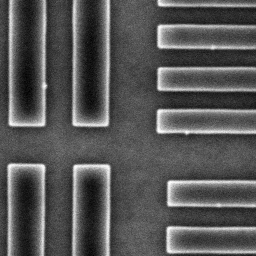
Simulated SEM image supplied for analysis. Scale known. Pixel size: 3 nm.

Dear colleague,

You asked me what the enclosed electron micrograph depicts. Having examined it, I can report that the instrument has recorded groups of lines, slits or small figures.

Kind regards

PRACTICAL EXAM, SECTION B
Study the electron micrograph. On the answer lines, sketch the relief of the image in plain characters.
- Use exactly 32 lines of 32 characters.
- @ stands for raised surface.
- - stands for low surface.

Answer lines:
-@@@@@---@@@@@------@@@@@@@@@@@@
-@@@@@---@@@@@------------------
-@@@@@---@@@@@------------------
-@@@@@---@@@@@------@@@@@@@@@@@@
-@@@@@---@@@@@------@@@@@@@@@@@@
-@@@@@---@@@@@------@@@@@@@@@@@@
-@@@@@---@@@@@------------------
-@@@@@---@@@@@------------------
-@@@@@---@@@@@------------------
-@@@@@---@@@@@------@@@@@@@@@@@@
-@@@@@---@@@@@------@@@@@@@@@@@@
-@@@@@---@@@@@------------------
-@@@@@---@@@@-------------------
-@@@@@---@@@@-------------------
-@@@@@---@@@@-------@@@@@@@@@@@@
-@@@@----@@@@-------@@@@@@@@@@@@
--------------------@@@@@@@@@@@@
--------------------------------
--------------------------------
--------------------------------
--------------------------------
-@@@@----@@@@@------------------
-@@@@----@@@@@------------------
-@@@@----@@@@@-------@@@@@@@@@@@
-@@@@----@@@@@-------@@@@@@@@@@@
-@@@@----@@@@@-------@@@@@@@@@@@
-@@@@----@@@@@------------------
-@@@@----@@@@@------------------
-@@@@----@@@@@-------@@@--------
-@@@@----@@@@@-------@@@@@@@@@@@
-@@@@----@@@@@-------@@@@@@@@@@@
-@@@@----@@@@@----------------@-